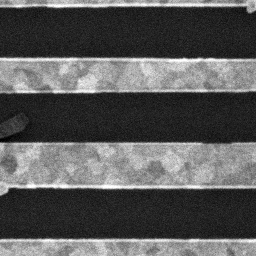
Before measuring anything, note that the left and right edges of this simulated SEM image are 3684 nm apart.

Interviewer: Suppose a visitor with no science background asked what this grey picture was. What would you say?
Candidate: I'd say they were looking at lines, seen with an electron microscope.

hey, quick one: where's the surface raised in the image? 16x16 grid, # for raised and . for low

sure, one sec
...............#
................
................
................
################
################
................
................
................
################
################
################
................
................
................
################